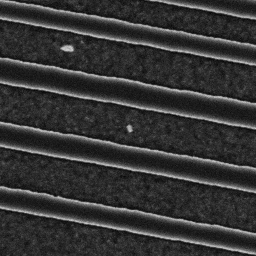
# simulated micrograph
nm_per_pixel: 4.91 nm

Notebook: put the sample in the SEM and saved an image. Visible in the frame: lines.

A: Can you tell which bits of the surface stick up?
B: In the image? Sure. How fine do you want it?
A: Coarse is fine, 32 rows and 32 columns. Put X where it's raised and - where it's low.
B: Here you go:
XXXX-----------------XXXXXXXXXXX
XXXXXXXXX------------------XXXXX
-XXXXXXXXXXXXXX-----------------
------XXXXXXXXXXXXXX------------
------------XXXXXXXXXXXXX-------
-----------------XXXXXXXXXXXXXX-
-----------------------XXXXXXXXX
XX--------------------------XXXX
XXXXXXXX------------------------
XXXXXXXXXXXXX-------------------
-XXXXXXXXXXXXXXXXX--------------
-------XXXXXXXXXXXXXXXXX--------
------------XXXXXXXXXXXXXXXXXX--
-----------------XXXXXXXXXXXXXXX
-----------------------XXXXXXXXX
X---------------------------XXXX
XXXXXXX-------------------------
XXXXXXXXXXXX--------------------
-XXXXXXXXXXXXXXXXX--------------
------XXXXXXXXXXXXXXXXX---------
------------XXXXXXXXXXXXXXXXX---
------------------XXXXXXXXXXXXXX
-----------------------XXXXXXXXX
X----------------------------XXX
XXXXXXX-------------------------
XXXXXXXXXXXX--------------------
---XXXXXXXXXXXXXXX--------------
--------XXXXXXXXXXXXXXX---------
--------------XXXXXXXXXXXXXXX---
-------------------XXXXXXXXXXXXX
-------------------------XXXXXXX
------------------------------XX